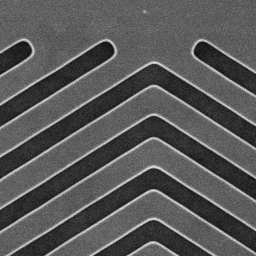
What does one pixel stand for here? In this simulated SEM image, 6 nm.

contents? groups of lines, slits or small figures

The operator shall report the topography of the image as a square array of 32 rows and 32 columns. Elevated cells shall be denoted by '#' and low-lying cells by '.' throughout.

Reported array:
################################
################################
################################
################################
################################
##..########..###########.######
....#######...##########....####
...######....############....###
..######....######...#####.....#
######....######......######....
####.....######.........######..
###....######....####....######.
#.....######....#######....#####
....######....##########....####
..######.....######.######....##
.######....######....######.....
#####.....######.......######...
###.....######....##.....#####..
##....######.....#####....######
.....######....########.....####
...######....############....###
..#####.....######...#####.....#
######....######......######....
####.....######.........######..
###....######.....###....######.
#.....#####.....######.....#####
....######....##########....####
..######.....######.######....##
.######....######....######....#
#####.....######.......######...
###.....######....##....######..
##....######.....#####....######